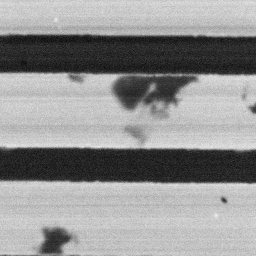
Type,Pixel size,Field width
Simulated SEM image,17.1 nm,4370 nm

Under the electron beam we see lines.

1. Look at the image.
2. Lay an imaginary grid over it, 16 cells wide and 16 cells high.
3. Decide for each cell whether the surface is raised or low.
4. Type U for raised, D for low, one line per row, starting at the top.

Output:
UUUUUUUUUUUUUUUU
UUUUUUUUUUUUUUUU
DDDDDDDDDDDDDDDD
DDDDDDDDDDDDDDDD
DDDDDDDDDDDDDDDD
UUUUUUUUUUUUUUUU
UUUUUUUUUUUUUUUU
UUUUUUUUUUUUUUUU
UUUUUUUUUUUUUUUU
DDDDDDDDDDDDDDDD
DDDDDDDDDDDDDDDD
UUUUUUUUUUUUUUUU
UUUUUUUUUUUUUUUU
UUUUUUUUUUUUUUUU
UUUUUUUUUUUUUUUU
UUUUUUUUUUUUUUUU